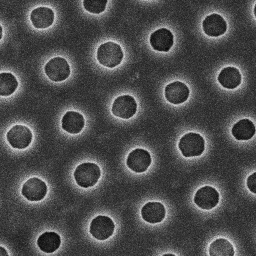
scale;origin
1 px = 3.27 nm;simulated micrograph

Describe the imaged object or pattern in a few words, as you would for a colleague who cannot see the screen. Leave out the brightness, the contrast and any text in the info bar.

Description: a regular array of holes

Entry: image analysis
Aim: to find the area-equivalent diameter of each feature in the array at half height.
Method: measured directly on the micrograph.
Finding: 80.4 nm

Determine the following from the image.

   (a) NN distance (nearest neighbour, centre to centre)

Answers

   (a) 0.177 um